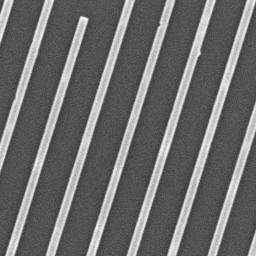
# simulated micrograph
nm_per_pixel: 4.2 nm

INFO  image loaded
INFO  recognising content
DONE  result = parallel lines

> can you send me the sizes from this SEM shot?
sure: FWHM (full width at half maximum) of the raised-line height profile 32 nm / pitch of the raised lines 162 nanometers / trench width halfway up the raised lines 128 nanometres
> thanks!